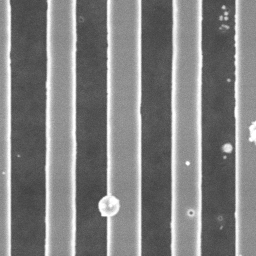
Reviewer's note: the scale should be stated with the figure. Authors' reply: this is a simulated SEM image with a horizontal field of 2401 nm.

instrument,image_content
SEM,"lines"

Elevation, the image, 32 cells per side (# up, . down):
#.....###.....####....###.....##
#.....###....#####....###.....##
#.....###....#####....###.....##
#.....###....#####....###.....##
#.....###.....###.....###.....##
#.....###.....####....###.....##
#.....###.....####....###.....##
#.....###....#####....###.....##
#.....###....#####....###.....##
#.....###....#####....###.....##
#.....###.....####....###.....##
#.....###....#####....###.....##
#.....###.....###.....###.....##
#.....###....####.....###....###
#.....###....#####....###....###
#.....###....#####....###.....##
#.....###....#####....###.....##
#.....###....#####....###.....##
#.....###....#####....###.....##
#.....###....#####....###.....##
#.....###.....####....###.....##
#.....###....#####....###.....##
#.....###....#####....###.....##
#.....###....#####....###.....##
#.....###....#####....###.....##
#.....###...######....###.....##
#.....###....#####....###.....##
#.....###....#####....###.....##
#.....###....#####....###.....##
#.....###....#####....###.....##
#.....###....#####....###.....##
#.....###....#####....###.....##